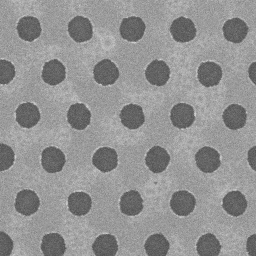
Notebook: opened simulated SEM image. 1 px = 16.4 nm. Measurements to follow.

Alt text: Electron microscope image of a regular array of holes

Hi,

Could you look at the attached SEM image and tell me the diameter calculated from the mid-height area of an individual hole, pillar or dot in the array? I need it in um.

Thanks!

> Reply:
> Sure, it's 0.441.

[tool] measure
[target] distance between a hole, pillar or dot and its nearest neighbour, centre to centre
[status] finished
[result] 0.82 um